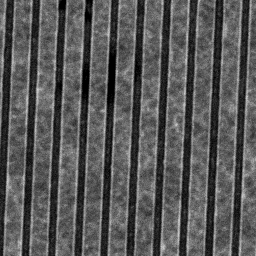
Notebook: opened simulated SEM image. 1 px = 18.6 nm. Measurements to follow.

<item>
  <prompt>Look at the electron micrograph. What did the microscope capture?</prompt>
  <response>parallel lines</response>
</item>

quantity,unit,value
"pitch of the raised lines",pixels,26.2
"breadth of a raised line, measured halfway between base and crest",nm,321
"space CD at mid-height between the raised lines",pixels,8.62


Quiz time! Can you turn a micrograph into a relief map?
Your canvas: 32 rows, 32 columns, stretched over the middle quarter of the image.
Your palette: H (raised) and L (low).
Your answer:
HHHHLLLHHHHLLHHHHHLLHHHHLLHHHHLL
HHHHLLLHHHHLLHHHHLLLHHHHLLHHHHLL
HHHHLLLHHHHLLHHHHLLLHHHHLLHHHHHL
HHHHLLLHHHHLLHHHHLLLHHHHLLHHHHLL
HHHHLLLHHHHLLHHHHLLLHHHHLLHHHHLL
HHHHLLLHHHHLLHHHHLLLHHHHLLHHHHLL
HHHHLLHHHHHLLHHHHLLLHHHHLLHHHHLL
HHHHLLHHHHHLLHHHHLLLHHHHLLHHHHLL
HHHHLLHHHHLLLHHHHLLHHHHHLLHHHHLL
HHHHLLHHHHLLLHHHHLLHHHHHLLHHHHLL
HHHHLLHHHHLLLHHHHLLHHHHHLLHHHHLL
HHHHLLHHHHLLLHHHHLLHHHHHLLHHHHLL
HHHHLLHHHHLLLHHHHLLHHHHLLLHHHHLL
HHHHLLHHHHLLLHHHHLLHHHHLLLHHHHLL
HHHHLLHHHHLLLHHHHLLHHHHLLLHHHHLL
HHHHLLHHHHLLLHHHHLLHHHHLLLHHHHLL
HHHHLLHHHHLLLHHHHLLHHHHLLHHHHHLL
HHHHLLHHHHLLHHHHHLLHHHHLLHHHHHLL
HHHHLLHHHHLLHHHHHLLHHHHLLHHHHHLL
HHHHLLHHHHLLHHHHHLLHHHHLLLHHHHLL
HHHLLLHHHHLLHHHHHLLHHHHLLLHHHHLL
HHHLLLHHHHLLHHHHLLLHHHHLLHHHHHLL
HHHLLLHHHHLLHHHHLLLHHHHLLHHHHHLL
HHHLLLHHHHLLHHHHLLLHHHHLLHHHHLLL
HHHLLLHHHHLLHHHHLLLHHHHLLHHHHLLL
HHHLLLHHHHLLHHHHLLLHHHHLLHHHHLLL
HHHLLLHHHHLLHHHHLLLHHHHLLHHHHLLL
HHHLLLHHHHLLHHHHLLLHHHHLLHHHHLLL
HHHLLLHHHHLLHHHHLLHHHHHLLHHHHLLL
HHHLLHHHHHLLHHHHLLHHHHHLLHHHHLLL
HHHLLHHHHHLLHHHHLLHHHHHLLHHHHLLL
HHHLLHHHHLLLHHHHLLHHHHHLLHHHHLLH